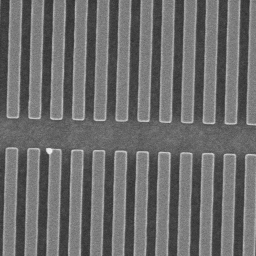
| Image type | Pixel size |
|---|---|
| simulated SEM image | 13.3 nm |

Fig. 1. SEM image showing groups of lines, slits or small figures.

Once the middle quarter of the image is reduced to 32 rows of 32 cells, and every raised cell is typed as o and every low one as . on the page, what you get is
..ooo...ooo..ooo...ooo..ooo...oo
..ooo...ooo..ooo...ooo..ooo...oo
..ooo...ooo..ooo...ooo..ooo...oo
..ooo...ooo..ooo...ooo..ooo...oo
..ooo...ooo..ooo...oo...ooo...oo
..ooo...ooo..ooo...oo...ooo...oo
..ooo...ooo..ooo...oo...ooo..ooo
..ooo...ooo..ooo...oo...ooo..ooo
..ooo...ooo..ooo...oo...ooo..ooo
..ooo...ooo..ooo...oo...ooo..ooo
..ooo...ooo..ooo...oo...ooo..ooo
..ooo...ooo..ooo...oo...ooo..ooo
..ooo...oo...ooo...oo...ooo..ooo
..ooo...oo...ooo...oo...ooo..ooo
.........................o....oo
................................
................................
................................
................................
................................
................................
................................
..ooo..ooo...ooo..ooo...oo...ooo
..ooo..ooo...ooo..ooo...oo...ooo
..ooo..ooo...ooo..ooo...oo...ooo
..ooo..ooo...ooo..ooo...oo...ooo
..ooo..ooo...ooo..ooo...oo...ooo
..ooo..ooo...oo...ooo...oo...ooo
..ooo..ooo...oo...ooo...oo...ooo
..oo...ooo..ooo...ooo..ooo...ooo
..oo...ooo..ooo...ooo..ooo...ooo
..oo...ooo..ooo...ooo..ooo...ooo